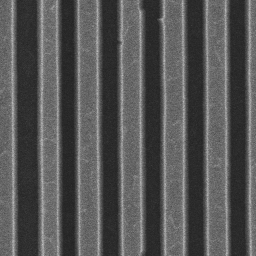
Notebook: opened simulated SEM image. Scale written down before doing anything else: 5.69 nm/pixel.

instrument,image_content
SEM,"parallel lines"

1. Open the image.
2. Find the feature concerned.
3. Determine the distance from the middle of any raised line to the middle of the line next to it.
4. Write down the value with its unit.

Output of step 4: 238 nm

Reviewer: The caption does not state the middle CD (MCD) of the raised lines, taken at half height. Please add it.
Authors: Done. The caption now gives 137 nanometres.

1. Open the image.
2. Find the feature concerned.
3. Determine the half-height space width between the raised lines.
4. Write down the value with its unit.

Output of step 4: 106 nanometres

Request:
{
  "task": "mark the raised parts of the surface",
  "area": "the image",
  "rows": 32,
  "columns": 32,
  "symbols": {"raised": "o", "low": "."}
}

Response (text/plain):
oo...oo...oo...ooo..ooo...ooo..o
oo...oo...oo...ooo..ooo...ooo..o
oo...oo...oo...ooo..ooo...oo...o
oo...oo...oo...ooo..ooo...oo...o
oo...oo...oo...ooo..ooo...oo...o
oo...oo...oo...ooo..ooo...oo...o
oo...oo...oo...ooo..ooo...oo...o
oo...oo...ooo..ooo..ooo...ooo..o
oo...oo...ooo..ooo..ooo...ooo..o
oo...ooo..ooo..ooo..ooo...oo...o
oo...ooo..ooo..ooo..ooo...oo...o
oo...ooo..ooo..ooo..ooo...oo...o
oo...oo...ooo..ooo..ooo...oo...o
oo...oo...ooo..ooo..ooo...oo...o
oo...oo...ooo..ooo..ooo...oo...o
oo...oo...ooo..ooo..ooo...oo...o
oo...ooo..ooo..ooo..ooo...oo...o
oo...ooo..ooo..ooo..ooo...oo...o
oo...ooo..oo...ooo..ooo...oo...o
oo...ooo..ooo..ooo..ooo...oo...o
oo...ooo..ooo..ooo..ooo...ooo..o
oo...oo...ooo..ooo..ooo...ooo..o
oo...oo...ooo..ooo..ooo...ooo..o
oo...oo...ooo..ooo..ooo...ooo..o
oo...oo...ooo..ooo..ooo...ooo..o
oo...oo...ooo..ooo..ooo...ooo..o
oo...oo...ooo..ooo..ooo...ooo..o
oo...oo...ooo..ooo..ooo...ooo..o
oo...oo...ooo..ooo..ooo...ooo..o
oo...oo...ooo..ooo..ooo...ooo..o
oo...oo...ooo..ooo..ooo...ooo..o
oo...oo...ooo..ooo..ooo...ooo..o